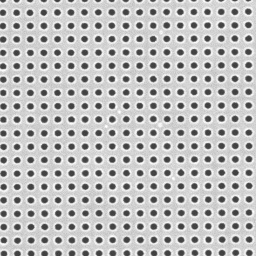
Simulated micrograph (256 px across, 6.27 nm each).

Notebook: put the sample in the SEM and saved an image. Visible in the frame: a regular array of holes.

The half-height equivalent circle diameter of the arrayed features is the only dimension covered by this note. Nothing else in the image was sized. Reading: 42.4 nm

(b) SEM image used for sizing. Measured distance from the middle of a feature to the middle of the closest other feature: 82.5 nm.